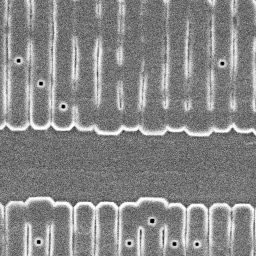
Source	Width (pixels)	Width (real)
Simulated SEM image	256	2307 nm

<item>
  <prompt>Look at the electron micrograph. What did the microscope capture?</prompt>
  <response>wiring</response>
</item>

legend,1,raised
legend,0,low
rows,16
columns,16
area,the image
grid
1111111111111111
1111111111111111
1111111111111111
1111111111111111
1111111111111111
1111111111111111
1111111111111111
1111111111111111
0000000000000000
0000000000000000
0000000000000000
0000000000000000
0010000001000000
1111111111111111
1111111111111111
1111111111111111